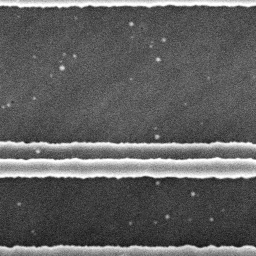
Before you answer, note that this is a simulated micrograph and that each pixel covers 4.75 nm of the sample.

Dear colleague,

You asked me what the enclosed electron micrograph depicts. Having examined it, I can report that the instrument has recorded lines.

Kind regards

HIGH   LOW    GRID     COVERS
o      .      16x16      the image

................
................
................
................
................
................
................
................
................
oooooooooooooooo
oooooooooooooooo
................
................
................
................
oooooooooooooooo